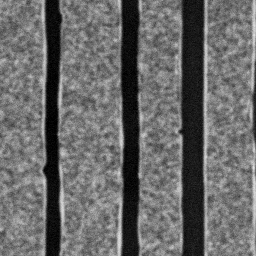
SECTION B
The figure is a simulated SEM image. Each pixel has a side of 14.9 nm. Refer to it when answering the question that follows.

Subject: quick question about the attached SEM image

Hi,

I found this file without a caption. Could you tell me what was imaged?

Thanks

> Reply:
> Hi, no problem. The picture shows one or a few lines or trenches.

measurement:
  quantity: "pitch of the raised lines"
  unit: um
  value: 1.03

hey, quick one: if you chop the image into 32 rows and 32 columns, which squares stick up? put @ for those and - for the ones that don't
@@@@@---@@@@@@@---@@@@@---@@@@@@
@@@@@---@@@@@@@---@@@@@---@@@@@@
@@@@@---@@@@@@@---@@@@@---@@@@@@
@@@@@@--@@@@@@@--@@@@@@---@@@@@@
@@@@@@--@@@@@@@--@@@@@@---@@@@@@
@@@@@@--@@@@@@@--@@@@@@---@@@@@@
@@@@@@--@@@@@@@--@@@@@@---@@@@@@
@@@@@@--@@@@@@@--@@@@@@---@@@@@@
@@@@@@--@@@@@@@--@@@@@@---@@@@@@
@@@@@@--@@@@@@@--@@@@@@---@@@@@@
@@@@@@--@@@@@@@--@@@@@@---@@@@@@
@@@@@@--@@@@@@@--@@@@@@---@@@@@@
@@@@@@--@@@@@@@--@@@@@@---@@@@@@
@@@@@---@@@@@@@--@@@@@@---@@@@@-
@@@@@@--@@@@@@@---@@@@@---@@@@@-
@@@@@--@@@@@@@@---@@@@@---@@@@@-
@@@@@--@@@@@@@@---@@@@----@@@@@@
@@@@@--@@@@@@@@---@@@@@---@@@@@@
@@@@@@-@@@@@@@@---@@@@@---@@@@@@
@@@@@@-@@@@@@@@---@@@@@---@@@@@@
@@@@@@--@@@@@@@---@@@@@---@@@@@@
@@@@@---@@@@@@@--@@@@@@---@@@@@@
@@@@@@--@@@@@@@--@@@@@@---@@@@@@
@@@@@@--@@@@@@@---@@@@@---@@@@@@
@@@@@@--@@@@@@@---@@@@@---@@@@@@
@@@@@@--@@@@@@@---@@@@@---@@@@@@
@@@@@@--@@@@@@@--@@@@@@---@@@@@@
@@@@@@--@@@@@@@--@@@@@@---@@@@@@
@@@@@@--@@@@@@@--@@@@@@---@@@@@@
@@@@@@--@@@@@@@---@@@@@---@@@@@@
@@@@@@--@@@@@@@---@@@@@---@@@@@@
@@@@@@--@@@@@@@---@@@@@---@@@@@@